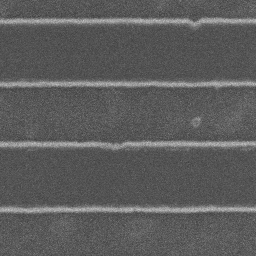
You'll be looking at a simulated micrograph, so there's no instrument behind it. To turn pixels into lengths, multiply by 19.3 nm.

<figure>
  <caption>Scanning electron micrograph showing one or a few lines or trenches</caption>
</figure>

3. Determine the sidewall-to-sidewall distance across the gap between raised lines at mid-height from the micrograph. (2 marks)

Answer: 1180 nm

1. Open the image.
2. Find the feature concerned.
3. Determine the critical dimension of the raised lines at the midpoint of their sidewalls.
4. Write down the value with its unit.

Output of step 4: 1210 nm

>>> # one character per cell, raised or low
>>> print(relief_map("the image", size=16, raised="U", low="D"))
DDDDDDDDDDDDDDDD
UUUUUUUUUUUUUUUU
UUUUUUUUUUUUUUUU
UUUUUUUUUUUUUUUU
UUUUUUUUUUUUUUUU
DDDDDDDDDDDDDDDD
DDDDDDDDDDDDDDDD
DDDDDDDDDDDDDDDD
DDDDDDDDDDDDDDDD
UUUUUUUUUUUUUUUU
UUUUUUUUUUUUUUUU
UUUUUUUUUUUUUUUU
UUUUUUUUUUUUUUUU
DDDDDDDDDDDDDDDD
DDDDDDDDDDDDDDDD
DDDDDDDDDDDDDDDD